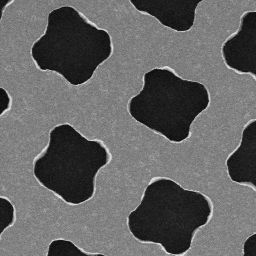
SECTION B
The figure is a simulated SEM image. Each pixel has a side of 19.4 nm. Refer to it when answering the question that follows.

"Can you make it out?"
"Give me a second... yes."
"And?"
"holes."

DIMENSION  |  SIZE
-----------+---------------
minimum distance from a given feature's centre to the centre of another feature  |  2160 nm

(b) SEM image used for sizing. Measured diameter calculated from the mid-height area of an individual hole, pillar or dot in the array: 1.36 micrometres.